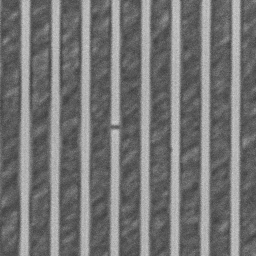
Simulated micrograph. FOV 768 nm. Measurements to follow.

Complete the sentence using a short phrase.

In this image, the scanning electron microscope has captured parallel lines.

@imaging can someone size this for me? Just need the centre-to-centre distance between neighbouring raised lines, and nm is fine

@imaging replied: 90.3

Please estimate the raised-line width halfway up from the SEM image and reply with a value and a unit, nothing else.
20.3 nanometers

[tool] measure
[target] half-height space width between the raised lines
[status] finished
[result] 0.0695 µm